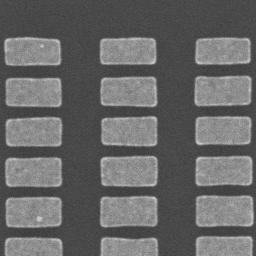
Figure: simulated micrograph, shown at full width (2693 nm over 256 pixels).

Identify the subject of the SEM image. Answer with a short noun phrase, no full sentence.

wiring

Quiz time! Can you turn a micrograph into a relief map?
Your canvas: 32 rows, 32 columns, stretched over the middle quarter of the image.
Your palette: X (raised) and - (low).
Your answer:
--------------------------------
--------------------------------
--------------------------------
----------------XXXXXX----------
----------XXXXXXXXXXXXX---------
----------XXXXXXXXXXXXX---------
---------XXXXXXXXXXXXXX---------
---------XXXXXXXXXXXXXX---------
---------XXXXXXXXXXXXXX---------
----------XXXXXXXXXXXXX---------
--------------------XXX---------
--------------------------------
--------------------------------
---------------XXXXXXXX---------
----------XXXXXXXXXXXXX---------
----------XXXXXXXXXXXXX---------
----------XXXXXXXXXXXXX---------
----------XXXXXXXXXXXXX---------
----------XXXXXXXXXXXXX---------
----------XXXXXXXXXXXXX---------
--------------------------------
--------------------------------
--------------------------------
---------------XXXXXXXX---------
---------XXXXXXXXXXXXXX---------
---------XXXXXXXXXXXXXX---------
----------XXXXXXXXXXXXX---------
----------XXXXXXXXXXXXX---------
----------XXXXXXXXXXXXX---------
----------XXXXXXXXXXXXX---------
----------------XXXX------------
--------------------------------